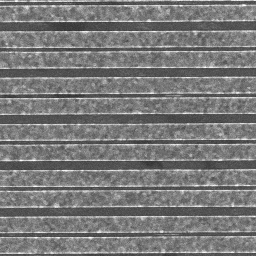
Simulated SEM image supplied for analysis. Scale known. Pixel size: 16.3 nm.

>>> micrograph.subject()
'parallel lines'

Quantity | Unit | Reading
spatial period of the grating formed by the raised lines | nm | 377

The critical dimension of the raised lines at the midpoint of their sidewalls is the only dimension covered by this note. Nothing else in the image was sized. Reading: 267 nm